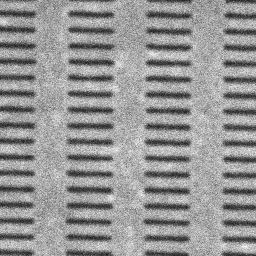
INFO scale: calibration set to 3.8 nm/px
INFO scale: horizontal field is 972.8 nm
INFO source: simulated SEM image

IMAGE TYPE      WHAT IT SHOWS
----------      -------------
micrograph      a regular array of holes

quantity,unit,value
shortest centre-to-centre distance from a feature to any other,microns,0.0605